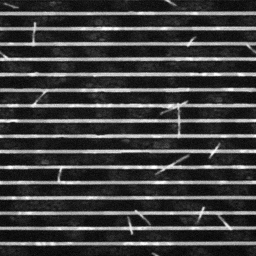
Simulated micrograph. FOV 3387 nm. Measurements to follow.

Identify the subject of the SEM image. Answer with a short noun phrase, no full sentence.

parallel lines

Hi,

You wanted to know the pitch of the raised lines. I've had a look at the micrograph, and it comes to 0.203 microns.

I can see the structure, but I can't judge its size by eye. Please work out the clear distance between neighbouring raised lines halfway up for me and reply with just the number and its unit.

0.162 µm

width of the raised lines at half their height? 39.7 nm